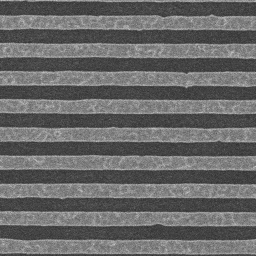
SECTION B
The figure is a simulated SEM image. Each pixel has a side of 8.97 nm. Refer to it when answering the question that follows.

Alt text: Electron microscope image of parallel lines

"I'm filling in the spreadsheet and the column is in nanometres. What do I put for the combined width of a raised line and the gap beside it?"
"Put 252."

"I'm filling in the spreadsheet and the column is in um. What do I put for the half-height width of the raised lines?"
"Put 0.117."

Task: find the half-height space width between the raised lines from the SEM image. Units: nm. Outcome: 133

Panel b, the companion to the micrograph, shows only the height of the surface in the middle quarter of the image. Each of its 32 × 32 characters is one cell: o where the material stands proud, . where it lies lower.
................................
................................
oooooooooooooooooooooooooooooooo
oooooooooooooooooooooooooooooooo
oooooooooooooooooooooooooooooooo
..............................o.
................................
................................
................................
oooooooooooooooooooooooooooooooo
oooooooooooooooooooooooooooooooo
oooooooooooooooooooooooooooooooo
................................
................................
................................
................................
oooooooooooooooooooooooooooooooo
oooooooooooooooooooooooooooooooo
oooooooooooooooooooooooooooooooo
................................
................................
................................
................................
oooooooooooooooooooooooooooooooo
oooooooooooooooooooooooooooooooo
oooooooooooooooooooooooooooooooo
................................
................................
................................
................................
oooooooooooooooooooooooooooooooo
oooooooooooooooooooooooooooooooo